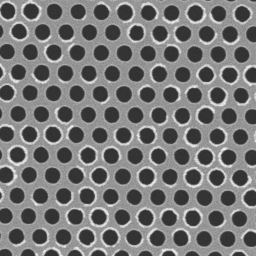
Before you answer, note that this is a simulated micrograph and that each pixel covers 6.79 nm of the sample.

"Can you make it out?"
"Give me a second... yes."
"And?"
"a regular array of holes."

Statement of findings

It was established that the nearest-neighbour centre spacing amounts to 0.157 µm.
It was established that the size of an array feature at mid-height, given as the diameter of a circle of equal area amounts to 0.105 microns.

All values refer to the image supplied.